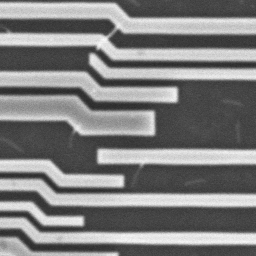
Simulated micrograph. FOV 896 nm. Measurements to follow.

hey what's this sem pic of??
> groups of lines, slits or small figures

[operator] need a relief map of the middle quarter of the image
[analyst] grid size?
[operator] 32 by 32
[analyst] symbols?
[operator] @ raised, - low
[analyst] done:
-------@@@@---------------------
--------@@@@@@@@@@@@@@@@@@@@@@@@
@@@@@@---@@@@@@@@@@@@@@@@@@@@@@@
@@@@@@@-----------@@@@@@@@@@@@@@
@@@@@@@@------------------------
@@@@@@@@@-----------------------
-----@@@@@@@@@@@@@@@@@@@@@@@----
------@@@@@@@@@@@@@@@@@@@@@@----
@@@@---@@@@@@@@@@@@@@@@@@@@@----
@@@@----------------------------
@@@@@---------------------------
@@@@@@--------------------------
@@@@@@@@@@@@@@@@@@@@@@----------
@@@@@@@@@@@@@@@@@@@@@@----------
-@@@@@@@@@@@@@@@@@@@@@----------
--@@@@@@@@@@@@@@@@@@@@----------
---@@@@@@@@@@@@@@@@@@@----------
-------------------@@@----------
--------------------------------
--------------------------------
--------------------------------
--------------------------------
---------@@@@@@@@@@@@@@@@@@@@@@@
---------@@@@@@@@@@@@@@@@@@@@@@@
---------@@@@@@@@@@@@@@@@@@@@@@@
--------------------------------
--------------------------------
--------------------------------
@@@@@@@@@@@@@@@-----------------
@@@@@@@@@@@@@@@-----------------
@@@@@@@@@@@@@@------------------
--------------------------------